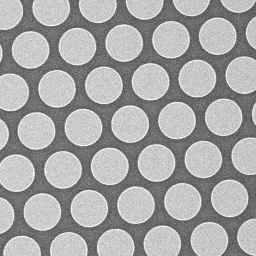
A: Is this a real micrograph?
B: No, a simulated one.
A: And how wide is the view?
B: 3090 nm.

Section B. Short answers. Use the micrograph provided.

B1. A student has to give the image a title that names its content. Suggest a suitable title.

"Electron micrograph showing an array of small figures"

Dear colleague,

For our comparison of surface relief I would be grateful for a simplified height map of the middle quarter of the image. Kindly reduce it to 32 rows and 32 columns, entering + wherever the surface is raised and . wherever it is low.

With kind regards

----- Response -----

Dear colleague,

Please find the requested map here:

...................+++++......++
........++++......+++++++....+++
+.....++++++++....++++++++...+++
++....++++++++...+++++++++...+++
++....++++++++...+++++++++...+++
+++..+++++++++...+++++++++...+++
+++..+++++++++...+++++++++....++
+++...++++++++....+++++++......+
++.....++++++......++++.........
+.......++++....................
................+.........+++++.
...+++........+++++......+++++++
..++++++.....+++++++....++++++++
.++++++++...+++++++++...++++++++
+++++++++...+++++++++...++++++++
+++++++++...+++++++++...++++++++
+++++++++...+++++++++...++++++++
.++++++++....+++++++.....++++++.
.++++++++.....+++++........+++..
..++++++.......++...............
.....................++++.......
.........++++.......++++++.....+
++......+++++++....++++++++....+
+++....+++++++++...++++++++...++
++++...+++++++++...+++++++++..++
++++...+++++++++...+++++++++...+
++++...+++++++++...++++++++....+
++++...+++++++++...++++++++.....
++++....+++++++......+++++......
+++......+++++..................
++.........................+++++
................+++++.....++++++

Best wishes